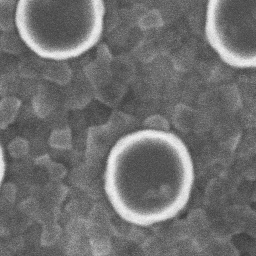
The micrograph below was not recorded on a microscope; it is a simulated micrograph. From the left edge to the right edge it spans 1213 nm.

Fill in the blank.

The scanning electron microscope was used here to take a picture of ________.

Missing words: raised bodies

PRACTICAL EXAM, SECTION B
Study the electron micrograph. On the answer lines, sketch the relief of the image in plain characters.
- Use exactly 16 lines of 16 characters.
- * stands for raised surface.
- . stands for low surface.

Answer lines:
.*****.......***
.*****.......***
..****.......***
..............**
................
................
................
................
.........*......
.......****.....
.......*****....
.......*****....
.......****.....
........**......
................
................